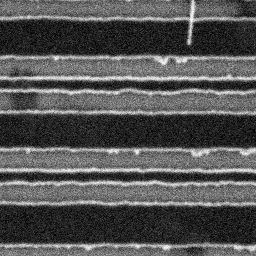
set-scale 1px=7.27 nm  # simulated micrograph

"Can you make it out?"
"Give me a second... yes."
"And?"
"lines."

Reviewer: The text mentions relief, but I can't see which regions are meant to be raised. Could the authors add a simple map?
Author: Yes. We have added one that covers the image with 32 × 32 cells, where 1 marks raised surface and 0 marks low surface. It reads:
00000000000000000000000000000000
00000000000000000000000000000000
11111111111111111111111111111111
11111111111111111111111111111111
11111111111111111111111111111111
11111111111111111111111111111111
11111111111111111111111111111111
00000000000000000000100000000000
00000000000000000000000000000000
00000000000000000000000000000000
11111111111111111111111111111111
00000000110011100011111000011111
00000000000000000000000000000000
00000000000000000000000000000000
11111111111111111111111111111111
11111111111111111111111111111111
11111111111111111111111111111111
11111111111111111111111111111111
11111111111111111111111111111111
00000000000000000000000000000000
00000000000000000000000000000000
11111111111111111111111111111111
11111111111111111111111111111111
00000000000000000000000000000000
00000000000000000000000000000000
11111111111111111111111111111111
11111111111111111111111111111111
11111111111111111111111111111111
11111111111111111111111111111111
11111111111111111111111111111111
11111111111111111111111111111111
00000000000000000000000000000000